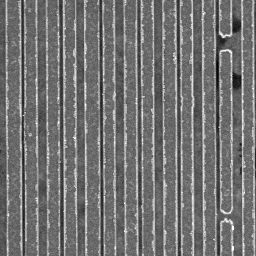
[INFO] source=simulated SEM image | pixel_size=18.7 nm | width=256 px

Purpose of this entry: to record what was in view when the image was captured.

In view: parallel lines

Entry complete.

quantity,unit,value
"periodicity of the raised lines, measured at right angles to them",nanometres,364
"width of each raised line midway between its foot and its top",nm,233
